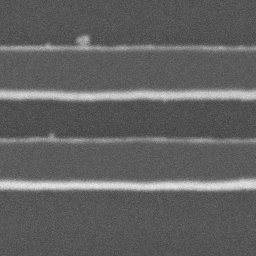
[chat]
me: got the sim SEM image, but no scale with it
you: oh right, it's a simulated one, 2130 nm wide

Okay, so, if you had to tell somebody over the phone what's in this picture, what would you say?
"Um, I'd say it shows lines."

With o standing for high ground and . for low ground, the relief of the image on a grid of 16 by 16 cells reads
................
................
................
oooooooooooooooo
oooooooooooooooo
oooooooooooooooo
................
................
................
oooooooooooooooo
oooooooooooooooo
oooooooooooooooo
................
................
................
................